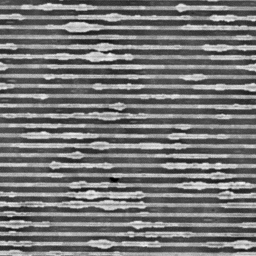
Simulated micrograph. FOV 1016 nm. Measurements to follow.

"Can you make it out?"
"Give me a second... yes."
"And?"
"parallel lines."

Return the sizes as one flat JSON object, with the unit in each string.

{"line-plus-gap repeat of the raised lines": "39.1 nanometers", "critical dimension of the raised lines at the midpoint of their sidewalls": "10.9 nm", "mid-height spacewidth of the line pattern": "24.8 nm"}